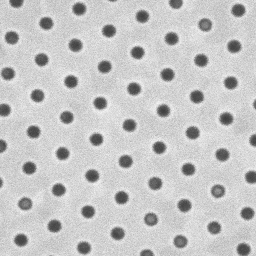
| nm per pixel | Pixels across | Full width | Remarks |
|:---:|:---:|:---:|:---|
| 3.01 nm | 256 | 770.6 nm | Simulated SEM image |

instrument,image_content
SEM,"a regular array of holes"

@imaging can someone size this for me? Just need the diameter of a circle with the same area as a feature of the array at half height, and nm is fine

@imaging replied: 43.6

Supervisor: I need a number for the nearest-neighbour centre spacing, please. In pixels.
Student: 36.1